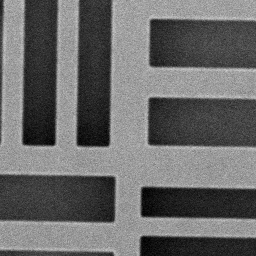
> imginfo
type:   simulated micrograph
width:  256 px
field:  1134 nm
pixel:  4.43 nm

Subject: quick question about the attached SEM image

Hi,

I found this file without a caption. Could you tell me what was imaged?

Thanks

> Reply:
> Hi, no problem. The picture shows groups of lines, slits or small figures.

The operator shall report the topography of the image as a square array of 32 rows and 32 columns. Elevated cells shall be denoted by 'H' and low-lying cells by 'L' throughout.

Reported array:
LHHLLLLHHHLLLLHHHHHHHHHHHHHHHHHH
LHHLLLLHHHLLLLHHHHHHHHHHHHHHHHHH
LHHLLLLHHHLLLLHHHHHLLLLLLLLLLLLH
HHHLLLLHHHLLLLHHHHHLLLLLLLLLLLLL
HHHLLLLHHHLLLLHHHHHLLLLLLLLLLLLL
HHHLLLLHHHLLLLHHHHHLLLLLLLLLLLLL
HHHLLLLHHHLLLLHHHHHLLLLLLLLLLLLL
HHHLLLLHHHLLLLHHHHHLLLLLLLLLLLLL
HHHLLLLHHHLLLLHHHHHLLLLLLLLLLLLL
HHHLLLLHHHLLLLHHHHHHHHHHHHHHHHHH
HHHLLLLHHHLLLLHHHHHHHHHHHHHHHHHH
HHHLLLLHHHLLLLHHHHHHHHHHHHHHHHHH
HHHLLLLHHHLLLLHHHHHLLLLLLLLLLLLL
HHHLLLLHHHLLLLHHHHLLLLLLLLLLLLLL
HHHLLLLHHLLLLLHHHHLLLLLLLLLLLLLL
HHHLLLLHHLLLLLHHHHLLLLLLLLLLLLLL
HHHLLLLHHLLLLLHHHHLLLLLLLLLLLLLL
HHHLLLLHHLLLLLHHHHLLLLLLLLLLLLLL
HHHHHHHHHHHHHHHHHHHHHHHHHHHHHHHH
HHHHHHHHHHHHHHHHHHHHHHHHHHHHHHHH
HHHHHHHHHHHHHHHHHHHHHHHHHHHHHHHH
HHHHHHHHHHHHHHHHHHHHHHHHHHHHHHHH
LLLLLLLLLLLLLLHHHHHHHHHHHHHHHHHH
LLLLLLLLLLLLLLLHHHLLLLLLLLLLLLLL
LLLLLLLLLLLLLLLHHHLLLLLLLLLLLLLL
LLLLLLLLLLLLLLLHHHLLLLLLLLLLLLLL
LLLLLLLLLLLLLLLHHHLLLLLLLLLLLLLL
LLLLLLLLLLLLLLHHHHHHHHHHHHHHHHHH
HHHHHHHHHHHHHHHHHHHHHHHHHHHHHHHH
HHHHHHHHHHHHHHHHHHLLLLLLLLHHHHHH
HHHHHHHHHHHHHHHHHLLLLLLLLLLLLLLL
LLLLLLLLLLLLLLHHHLLLLLLLLLLLLLLL